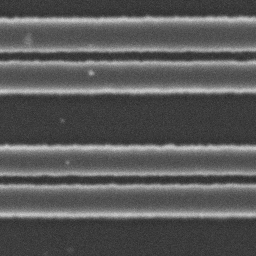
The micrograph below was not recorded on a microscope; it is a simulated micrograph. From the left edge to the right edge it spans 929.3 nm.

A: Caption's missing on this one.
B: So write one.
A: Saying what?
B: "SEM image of lines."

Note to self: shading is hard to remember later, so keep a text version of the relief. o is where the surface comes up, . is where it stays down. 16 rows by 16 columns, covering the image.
................
oooooooooooooooo
oooooooooooooooo
oooooooooooooooo
oooooooooooooooo
oooooooooooooooo
................
................
................
oooooooooooooooo
oooooooooooooooo
oooooooooooooooo
oooooooooooooooo
................
................
................